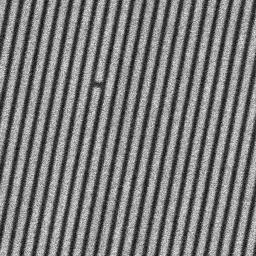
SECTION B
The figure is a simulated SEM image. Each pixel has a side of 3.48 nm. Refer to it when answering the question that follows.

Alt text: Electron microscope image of parallel lines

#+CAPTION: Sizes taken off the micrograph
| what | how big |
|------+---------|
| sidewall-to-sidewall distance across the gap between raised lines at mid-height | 17.9 nm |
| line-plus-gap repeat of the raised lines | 12.1 pixels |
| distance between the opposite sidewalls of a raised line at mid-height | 23.9 nanometres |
